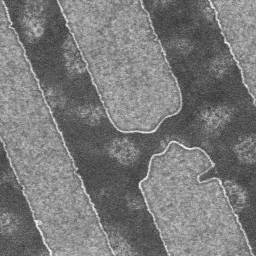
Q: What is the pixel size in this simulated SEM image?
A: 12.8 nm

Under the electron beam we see one or a few lines or trenches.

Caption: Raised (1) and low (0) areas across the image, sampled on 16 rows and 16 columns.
1111000001111000
0111000001111100
0111100000111100
0011100000111110
0011110000011110
0001110000011110
0001110000011111
0001111000111111
0000111111111111
0000111111000111
1000011110000111
1000011110000011
1100001110000011
1100001111000001
1110001111000001
1110000111000000